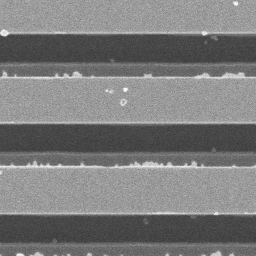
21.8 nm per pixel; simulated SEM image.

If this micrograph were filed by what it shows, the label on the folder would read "lines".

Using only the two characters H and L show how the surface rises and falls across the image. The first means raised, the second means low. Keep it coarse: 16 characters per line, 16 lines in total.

HHHHHHHHHHHHHHHH
HHHHHHHHHHHHHHHH
LLLLLLLLLLLLLLLL
LLLLLLLLLLLLLLLL
HHHHHHHHHHHHHHHH
HHHHHHHHHHHHHHHH
HHHHHHHHHHHHHHHH
HHHHHHHHHHHHHHHH
LLLLLLLLLLLLLLLL
LLLLLLLLLLLLLLLL
HHHHHHHHHHHHHHHH
HHHHHHHHHHHHHHHH
HHHHHHHHHHHHHHHH
LLLLLLLLLLLLLLLL
LLLLLLLLLLLLLLLL
HHHHHHHHHHHHHHHH